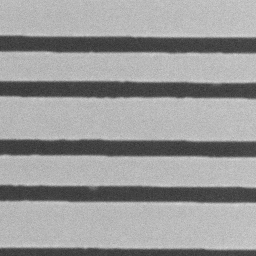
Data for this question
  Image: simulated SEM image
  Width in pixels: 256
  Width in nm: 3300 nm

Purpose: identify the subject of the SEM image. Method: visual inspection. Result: lines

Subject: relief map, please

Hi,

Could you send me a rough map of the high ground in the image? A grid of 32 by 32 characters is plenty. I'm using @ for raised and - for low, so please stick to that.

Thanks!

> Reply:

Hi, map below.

@@@@@@@@@@@@@@@@@@@@@@@@@@@@@@@@
@@@@@@@@@@@@@@@@@@@@@@@@@@@@@@@@
@@@@@@@@@@@@@@@@@@@@@@@@@@@@@@@@
@@@@@@@@@@@@@@@@@@@@@@@@@@@@@@@@
----------------@@@@@@@@@@@@@@@@
--------------------------------
--------------------------------
@@@@@@@@@@@@@@@@@@@@@@@@@@@@@@@@
@@@@@@@@@@@@@@@@@@@@@@@@@@@@@@@@
@@@@@@@@@@@@@@@@@@@@@@@@@@@@@@@@
--------------------------------
--------------------------------
@@@@@@@@@@@@@@@@@@@@@@@@@@@@@@@@
@@@@@@@@@@@@@@@@@@@@@@@@@@@@@@@@
@@@@@@@@@@@@@@@@@@@@@@@@@@@@@@@@
@@@@@@@@@@@@@@@@@@@@@@@@@@@@@@@@
@@@@@@@@@@@@@@@@@@@@@@@@@@@@@@@@
-----------------------@@@@@@@@@
--------------------------------
@@--@---------------------------
@@@@@@@@@@@@@@@@@@@@@@@@@@@@@@@@
@@@@@@@@@@@@@@@@@@@@@@@@@@@@@@@@
@@@@@@@@@@@@@@@@@@@@@@@@@@@@@@@@
--------------------------------
--------------------------------
@@@@@@@@@@@@@@@@@@@@@@@@@@@@@@@@
@@@@@@@@@@@@@@@@@@@@@@@@@@@@@@@@
@@@@@@@@@@@@@@@@@@@@@@@@@@@@@@@@
@@@@@@@@@@@@@@@@@@@@@@@@@@@@@@@@
@@@@@@@@@@@@@@@@@@@@@@@@@@@@@@@@
@@@@@@@@@@@@@@@@@@@@@@@@@@@@@@@@
--------------------------------